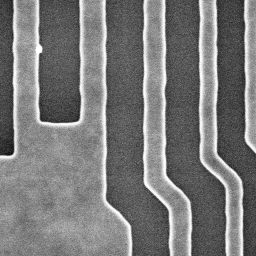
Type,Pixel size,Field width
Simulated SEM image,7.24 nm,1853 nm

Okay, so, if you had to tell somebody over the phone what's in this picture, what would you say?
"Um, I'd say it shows groups of lines, slits or small figures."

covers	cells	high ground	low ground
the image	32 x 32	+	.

..+++.....+++.....+++....++....+
..+++.....+++.....+++....++....+
..+++.....+++.....+++....++....+
..+++.....+++.....+++....++....+
..+++.....+++.....+++....++....+
..+++.....+++.....+++....++....+
..+++.....+++.....+++....++....+
..+++.....+++.....+++....++....+
..+++.....+++.....+++....++....+
..+++.....+++.....+++....++....+
..+++.....+++.....+++....++....+
..+++.....+++.....+++....++....+
..+++.....+++.....+++....++....+
..+++.....+++.....+++....++....+
..+++.....+++.....+++....++....+
..+++++.+++++.....+++....++....+
..+++++++++++.....+++....++....+
..+++++++++++.....+++....++....+
..+++++++++++.....+++....++....+
+++++++++++++.....+++....++.....
+++++++++++++.....+++....+++....
+++++++++++++.....+++.....+++...
+++++++++++++.....+++......+++..
+++++++++++++.....++++......++..
+++++++++++++......++++.....++..
++++++++++++++.......+++....++..
+++++++++++++++......+++....++..
++++++++++++++++.....+++....++..
++++++++++++++++.....+++....++..
++++++++++++++++.....+++....++..
++++++++++++++++.....+++....++..
++++++++++++++++.....+++....++..